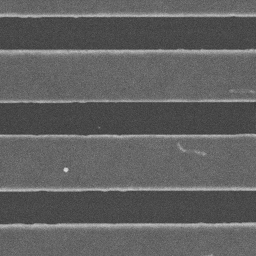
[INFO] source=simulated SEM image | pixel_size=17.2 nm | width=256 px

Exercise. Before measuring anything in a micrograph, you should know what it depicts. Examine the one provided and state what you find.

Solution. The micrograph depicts lines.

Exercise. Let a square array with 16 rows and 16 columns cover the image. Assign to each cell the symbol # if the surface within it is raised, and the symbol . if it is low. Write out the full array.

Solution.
################
................
................
################
################
################
................
................
################
################
################
################
................
................
################
################